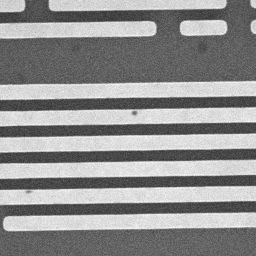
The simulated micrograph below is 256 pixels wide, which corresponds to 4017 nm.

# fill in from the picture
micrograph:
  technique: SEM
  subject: groups of lines, slits or small figures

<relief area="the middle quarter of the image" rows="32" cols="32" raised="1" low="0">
00000000000000000000000000000000
00000000000000000000000000000000
00000000000000000000000000000000
00000000000000000000000000000000
00000000000000000000000000000000
11111111111111111111111111111111
11111111111111111111111111111111
11111111111111111111111111111111
11100000000000000000000000000000
00000000000000000000000000000000
00000000000000000000000000000000
00000000000000000000001111111111
11111111111111111111111111111111
11111111111111111111111111111111
11111111111111111111111111111111
00000000000000000000000000000000
00000000000000000000000000000000
00000000000000000000000000000000
11111111111111111111111111111111
11111111111111111111111111111111
11111111111111111111111111111111
11111111000000000000000000000000
00000000000000000000000000000000
00000000000000000000000000000000
00000000000000000000111111111111
11111111111111111111111111111111
11111111111111111111111111111111
11111111111111111111111111111111
00000000000000000000000000000000
00000000000000000000000000000000
00000000000000000000000000000000
00111111111111111111111111111111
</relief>